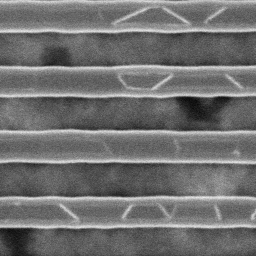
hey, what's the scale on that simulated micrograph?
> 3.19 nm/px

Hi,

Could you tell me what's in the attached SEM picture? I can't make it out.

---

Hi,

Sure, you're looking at wiring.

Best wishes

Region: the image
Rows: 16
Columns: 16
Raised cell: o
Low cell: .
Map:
oooooooooooooooo
oooooooooooooooo
................
................
oooooooooooooooo
oooooooooooooooo
................
................
oooooooooooooooo
oooooooooooooooo
................
................
oooooooooooooooo
oooooooooooooooo
................
................